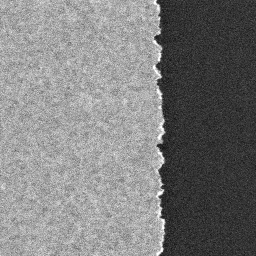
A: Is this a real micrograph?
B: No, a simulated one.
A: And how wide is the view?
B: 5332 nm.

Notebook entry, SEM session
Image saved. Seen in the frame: one or a few lines or trenches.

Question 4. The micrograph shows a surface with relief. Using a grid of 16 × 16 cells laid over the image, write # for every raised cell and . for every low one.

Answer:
##########......
##########......
##########......
##########......
##########......
##########......
##########......
##########......
##########......
##########......
##########......
##########......
##########......
##########......
##########......
##########......